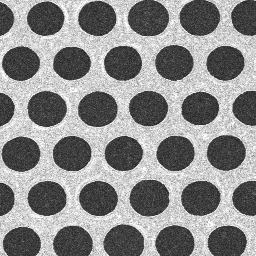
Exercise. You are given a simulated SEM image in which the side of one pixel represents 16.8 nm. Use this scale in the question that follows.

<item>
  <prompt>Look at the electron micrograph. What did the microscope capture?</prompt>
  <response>a regular array of holes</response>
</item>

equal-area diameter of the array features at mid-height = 0.622 microns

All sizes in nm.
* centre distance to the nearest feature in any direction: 860